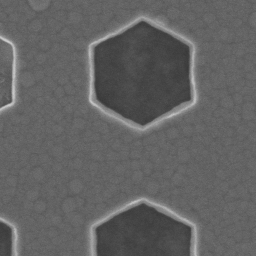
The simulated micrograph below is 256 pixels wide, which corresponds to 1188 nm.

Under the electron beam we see holes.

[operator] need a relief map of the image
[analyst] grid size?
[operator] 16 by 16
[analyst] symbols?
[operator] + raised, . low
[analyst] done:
++++++++++++++++
++++++++..++++++
+++++++....+++++
++++++......++++
++++++......++++
++++++......++++
++++++......++++
++++++++..++++++
++++++++++++++++
++++++++++++++++
++++++++++++++++
++++++++++++++++
++++++++++++++++
+++++++....+++++
.+++++......++++
.+++++......++++